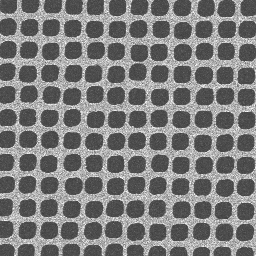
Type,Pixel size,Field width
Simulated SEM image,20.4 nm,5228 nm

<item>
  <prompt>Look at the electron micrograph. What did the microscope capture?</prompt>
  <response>a regular array of holes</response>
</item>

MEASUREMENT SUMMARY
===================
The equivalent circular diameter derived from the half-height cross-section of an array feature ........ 376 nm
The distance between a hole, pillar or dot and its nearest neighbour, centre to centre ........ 434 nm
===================